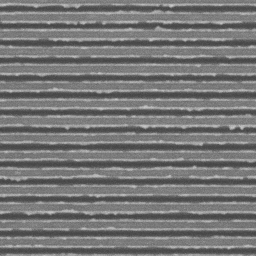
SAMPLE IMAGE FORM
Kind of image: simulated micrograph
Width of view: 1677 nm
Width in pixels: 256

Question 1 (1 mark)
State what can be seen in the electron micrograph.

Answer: parallel lines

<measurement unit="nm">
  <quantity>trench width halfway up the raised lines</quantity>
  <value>43.4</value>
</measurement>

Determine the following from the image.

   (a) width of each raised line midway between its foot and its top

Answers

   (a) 67.1 nanometers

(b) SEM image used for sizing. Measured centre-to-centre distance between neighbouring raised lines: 113 nm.